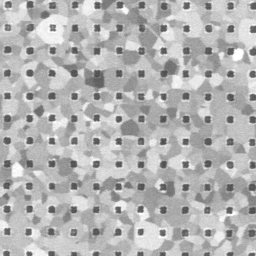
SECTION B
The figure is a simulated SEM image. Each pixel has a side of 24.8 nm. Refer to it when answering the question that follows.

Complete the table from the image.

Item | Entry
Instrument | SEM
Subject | a regular array of holes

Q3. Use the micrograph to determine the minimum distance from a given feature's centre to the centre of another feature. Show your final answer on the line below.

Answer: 546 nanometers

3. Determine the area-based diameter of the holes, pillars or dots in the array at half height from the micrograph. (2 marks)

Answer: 209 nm